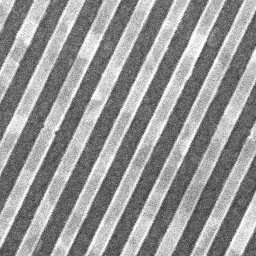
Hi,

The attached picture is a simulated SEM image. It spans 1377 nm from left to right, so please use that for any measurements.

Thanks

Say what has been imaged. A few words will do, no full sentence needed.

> parallel lines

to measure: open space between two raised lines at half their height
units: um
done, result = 0.0962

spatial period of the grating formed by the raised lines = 31.5 pixels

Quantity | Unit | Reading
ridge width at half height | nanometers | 72.6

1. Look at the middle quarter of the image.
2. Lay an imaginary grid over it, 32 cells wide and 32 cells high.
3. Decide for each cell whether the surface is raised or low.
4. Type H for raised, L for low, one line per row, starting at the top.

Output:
LLHHHHLLLLLHHHHLLLLLHHHLLLLLLHHH
LLHHHLLLLLHHHHLLLLLHHHHLLLLLHHHH
LHHHHLLLLLHHHHLLLLLHHHLLLLLLHHHH
LHHHLLLLLHHHHLLLLLHHHHLLLLLHHHHL
HHHHLLLLLHHHHLLLLLHHHLLLLLHHHHLL
HHHLLLLLLHHHLLLLLHHHHLLLLLHHHHLL
HHHLLLLLHHHHLLLLLHHHLLLLLLHHHLLL
HHLLLLLLHHHLLLLLLHHHLLLLLHHHHLLL
HHLLLLLHHHHLLLLLHHHLLLLLLHHHLLLL
HHLLLLLHHHLLLLLLHHHLLLLLHHHHLLLL
HLLLLLHHHHLLLLLHHHLLLLLLHHHLLLLL
HLLLLLHHHLLLLLLHHHLLLLLHHHHLLLLL
LLLLLHHHHLLLLLHHHLLLLLLHHHLLLLLL
LLLLLHHHLLLLLLHHHLLLLLHHHHLLLLLH
LLLLHHHHLLLLLHHHHLLLLLHHHLLLLLLH
LLLLHHHLLLLLLHHHLLLLLHHHHLLLLLHH
LLLHHHHLLLLLHHHHLLLLLHHHHLLLLLHH
LLLHHHLLLLLLHHHLLLLLHHHHLLLLLHHH
LLHHHHLLLLLHHHHLLLLLHHHHLLLLLHHH
LLHHHLLLLLLHHHLLLLLHHHHLLLLLHHHH
LHHHHLLLLLHHHHLLLLLHHHHLLLLLHHHL
LHHHLLLLLLHHHLLLLLHHHHLLLLLHHHHL
HHHHLLLLLHHHHLLLLLHHHHLLLLLHHHLL
HHHLLLLLLHHHLLLLLHHHHLLLLLHHHHLL
HHHLLLLLHHHHLLLLLHHHHLLLLLHHHLLL
HHLLLLLLHHHLLLLLHHHHLLLLLHHHHLLL
HHLLLLLHHHHLLLLLHHHHLLLLLHHHLLLL
HLLLLLLHHHLLLLLHHHHLLLLLHHHHLLLL
HLLLLLHHHHLLLLLHHHHLLLLLHHHLLLLL
HLLLLLHHHLLLLLHHHHLLLLLHHHHLLLLL
LLLLLHHHHLLLLLHHHHLLLLLHHHLLLLLH
LLLLLHHHLLLLLHHHHLLLLLHHHHLLLLLH